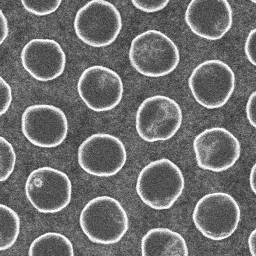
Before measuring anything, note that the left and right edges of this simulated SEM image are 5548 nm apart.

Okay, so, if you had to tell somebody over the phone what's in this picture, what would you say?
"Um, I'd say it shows a regular array of raised bodies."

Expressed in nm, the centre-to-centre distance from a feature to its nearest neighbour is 1390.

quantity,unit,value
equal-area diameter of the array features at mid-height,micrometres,0.945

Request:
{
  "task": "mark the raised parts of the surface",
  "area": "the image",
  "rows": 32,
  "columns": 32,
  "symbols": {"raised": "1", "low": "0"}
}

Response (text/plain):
00011110000111000111100011110000
00001100001111100000000111111000
10000000001111100000000111111000
10000000001111100000000011111000
10000000001111000111100001110001
00001110000110000111110000000001
00011111000000001111110000000001
00011111000000001111110000000001
00011111000010000111110001111000
00001110001111100000000011111000
10000000001111100000000011111000
10000000001111100000000011111000
10000000001111100011100001110001
10001110000111000011110000000001
00011111000000000111111000000001
00011111000000000111110000000000
00011111000000000111110000110000
10001111000111100010000001111100
10000000001111100000000011111100
11000000001111110000000001111100
11000000001111100001100001111000
10001110000111000011110000000001
00001111100000000111111000000001
00011111100000000111111000000000
00011111100000000011110000111000
00001111000111100001100001111000
11000000001111100000000011111100
11000000001111110000000011111100
11000000001111110000000001111000
11000111000111100011110000110001
10001111100000000011111000000001
00001111100000000011111000000000